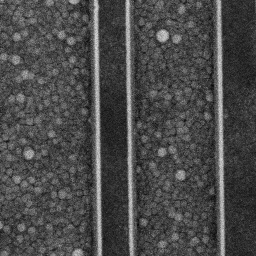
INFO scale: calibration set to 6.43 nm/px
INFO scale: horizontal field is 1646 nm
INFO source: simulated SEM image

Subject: one or a few lines or trenches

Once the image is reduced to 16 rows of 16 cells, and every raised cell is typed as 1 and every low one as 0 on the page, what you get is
0000001100000011
0000001100000011
0000001100000011
0000001100000011
0000001100000011
0000001100000011
0000001100000011
0000001100000011
0000001100000011
0000001100000011
0000001100000011
0000001100000011
0000001100000011
0000001100000011
0000001100000011
0000001100000011